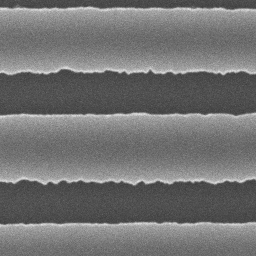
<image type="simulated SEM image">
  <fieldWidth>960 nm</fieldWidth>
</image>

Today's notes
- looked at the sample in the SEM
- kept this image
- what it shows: lines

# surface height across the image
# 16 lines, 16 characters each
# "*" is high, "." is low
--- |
.....*..........
****************
****************
****************
*.*.....****.*.*
................
................
****************
****************
****************
****************
................
................
................
****************
****************